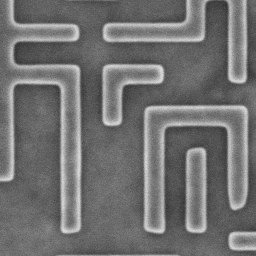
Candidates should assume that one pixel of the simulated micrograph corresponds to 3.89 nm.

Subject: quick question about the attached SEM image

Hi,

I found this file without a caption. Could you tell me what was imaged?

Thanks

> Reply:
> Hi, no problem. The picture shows wiring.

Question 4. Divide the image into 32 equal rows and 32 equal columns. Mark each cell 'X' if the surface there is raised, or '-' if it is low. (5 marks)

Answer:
XX---------------------XXX--XXX-
XX---------------------XXX---XX-
XX---------------------XXX---XX-
XXXXXXXXXX---XXXXXXXXXXXXX---XX-
XXXXXXXXXX---XXXXXXXXXXXXX---XX-
XX---------------------------XX-
XX---------------------------XX-
XX---------------------------XX-
XXXXXXXXXX---XXXXXXX---------XX-
XXXXXXXXXX---XXXXXXX---------XX-
XX-----XXX---XXX----------------
XX------XX---XX-----------------
XX------XX---XX-----------------
XX------XX---XX---XXXXXXXXXXXXX-
XX------XX---XX---XXXXXXXXXXXXX-
XX------XX---XX---XXXXXXXXXXXXX-
XX------XX--------XXX-------XXX-
XX------XX--------XX---------XX-
XX------XX--------XX---------XX-
XX------XX--------XX---XXX---XX-
XX------XX--------XX---XXX---XX-
XX------XX--------XX---XXX---XX-
X-------XX--------XX---XXX---XX-
--------XX--------XX---XXX---XX-
--------XX--------XX---XXX---XX-
--------XX--------XX---XXX---XX-
--------XX--------XX---XXX------
--------XX--------XXX--XXX------
--------XX--------XXX--XXX------
-----------------------------XXX
-----------------------------XXX
--------------------------------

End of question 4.